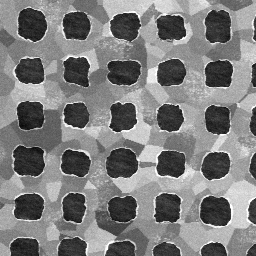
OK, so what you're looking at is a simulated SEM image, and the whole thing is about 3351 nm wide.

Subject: a regular array of holes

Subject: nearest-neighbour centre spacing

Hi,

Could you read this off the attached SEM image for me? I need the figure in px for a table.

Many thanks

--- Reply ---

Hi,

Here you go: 44.7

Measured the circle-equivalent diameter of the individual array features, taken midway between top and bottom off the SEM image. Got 388 nm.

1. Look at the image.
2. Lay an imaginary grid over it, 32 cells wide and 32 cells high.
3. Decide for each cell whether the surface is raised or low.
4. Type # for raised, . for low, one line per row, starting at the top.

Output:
################################
###..####.################..####
##....##...###....##...###...###
##....##...###...###...###...###
##....##...###...###...###...###
################################
################################
###..###...##########.#####.####
##...###...##.....##...###...##.
##....##...##....###...###...##.
####.####..###...###...###...###
################################
################################
##...###...###...###..####..####
##...###...###...###...###...##.
##...###...###...###...###...##.
##########################...##.
################################
##...###########################
##...###...###...###...###...###
##....##...##....###...##....##.
##...###...##....###...##....##.
##########################.#####
################################
##...###..##########..####.#####
##...###...###...##....##....##.
##...###...###...##....##....##.
###..###..####..####..###....##.
################################
################################
#....##....###...###..####..####
#....##....##....##....##...###.